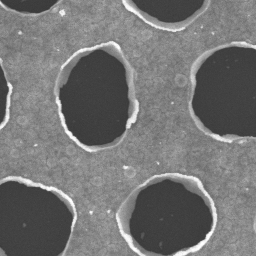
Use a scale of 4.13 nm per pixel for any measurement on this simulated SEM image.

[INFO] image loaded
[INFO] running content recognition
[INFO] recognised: holes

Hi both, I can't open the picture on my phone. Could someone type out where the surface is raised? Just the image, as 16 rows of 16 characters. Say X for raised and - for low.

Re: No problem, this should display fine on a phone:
X--XXXXX-----XXX
XXXXXXXXXX-XXXXX
XXXXXXXXXXXXXXXX
XXXXX---XXXXX---
XXXX----XXXX----
XXXX----XXXX----
XXXX----XXXX----
XXXX----XXXX----
XXXXX---XXXXXX--
XXXXXXXXXXXXXXXX
XXXXXXXXXXXXXXXX
-XXXXXXXX---XXXX
----XXXX-----XXX
-----XXX-----XXX
----XXXX-----XXX
----XXXXX---XXXX